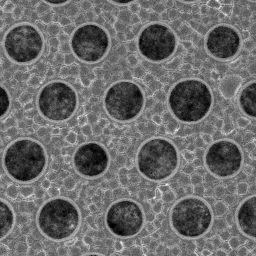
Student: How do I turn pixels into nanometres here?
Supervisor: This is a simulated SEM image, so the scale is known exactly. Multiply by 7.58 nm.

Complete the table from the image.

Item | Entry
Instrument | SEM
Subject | a regular array of holes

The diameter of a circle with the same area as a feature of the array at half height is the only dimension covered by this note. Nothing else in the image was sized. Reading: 0.295 µm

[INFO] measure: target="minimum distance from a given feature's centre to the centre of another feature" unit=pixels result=66.1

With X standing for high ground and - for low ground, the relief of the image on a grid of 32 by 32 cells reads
XXXXXXXXXXXXXXX-XXXXXXXXXXXXXXXX
XXXXXXXXXXXXXXXXXXXXXXXXXXXXXXXX
XXXXXXXXXXXXXXXXXXXXXXXXXXXXXXXX
XX--XXXXXX---XXXXX---XXXXXX--XXX
X----XXXX-----XXX-----XXXX----XX
X----XXXX-----XXX-----XXXX----XX
X----XXXX----XXXX-----XXXX----XX
XX--XXXXXX--XXXXXXX--XXXXXXXXXXX
XXXXXXXXXXXXXXXXXXXXXXXXXXXXXXXX
XXXXXXXXXXXXXXXXXXXXXXXXXXXXXXXX
XXXXXX--XXXXXX---XXXXX----XXXXX-
-XXXX----XXXX-----XXX-----XXXX--
-XXXX-----XXX-----XXX-----XXXX--
-XXXX----XXXX-----XXX-----XXXX--
XXXXXX---XXXXX---XXXXX----XXXXX-
XXXXXXXXXXXXXXXXXXXXXXXXXXXXXXXX
XXXXXXXXXXXXXXXXXXXXXXXXXXXXXXXX
XX--XXXXXXXXXXXXXXX--XXXXXXXXXXX
X----XXXXX---XXXXX----XXXX----XX
X-----XXX-----XXX-----XXXX----XX
X-----XXX-----XXX-----XXXX----XX
X----XXXXX---XXXXX----XXXX----XX
XX--XXXXXXXXXXXXXXX-XXXXXXXXXXXX
XXXXXXXXXXXXXXXXXXXXXXXXXXXXXXXX
XXXXXXXXXXXXXXXXXXXXXXXXXXXXXXXX
-XXXXX---XXXXX---XXXXX----XXXX--
--XXX-----XXX-----XXX-----XXXX--
--XXX-----XXX-----XXX-----XXXX--
-XXXX-----XXXX----XXXX----XXXX--
-XXXXX---XXXXXX-XXXXXXX--XXXXXX-
XXXXXXXXXXXXXXXXXXXXXXXXXXXXXXXX
XXXXXXXXXXXXXXXXXXXXXXXXXXXXXXXX